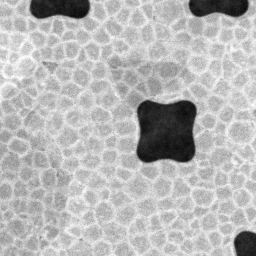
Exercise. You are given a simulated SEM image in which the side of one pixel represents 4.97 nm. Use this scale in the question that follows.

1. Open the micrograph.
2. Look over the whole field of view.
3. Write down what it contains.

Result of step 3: holes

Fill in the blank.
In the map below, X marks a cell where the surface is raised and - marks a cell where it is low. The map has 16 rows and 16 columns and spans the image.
XX----XXXXXX---X
XXXXXXXXXXXXXXXX
XXXXXXXXXXXXXXXX
XXXXXXXXXXXXXXXX
XXXXXXXXXXXXXXXX
XXXXXXXXXXXXXXXX
XXXXXXXXX---XXXX
XXXXXXXXX---XXXX
XXXXXXXXX---XXXX
XXXXXXXXX---XXXX
XXXXXXXXXXXXXXXX
XXXXXXXXXXXXXXXX
XXXXXXXXXXXXXXXX
XXXXXXXXXXXXXXXX
XXXXXXXXXXXXXXX-
XXXXXXXXXXXXXXX-